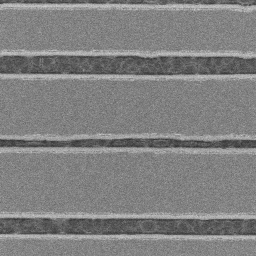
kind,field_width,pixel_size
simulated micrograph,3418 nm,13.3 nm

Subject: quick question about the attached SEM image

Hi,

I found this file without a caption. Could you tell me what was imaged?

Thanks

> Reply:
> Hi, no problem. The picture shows one or a few lines or trenches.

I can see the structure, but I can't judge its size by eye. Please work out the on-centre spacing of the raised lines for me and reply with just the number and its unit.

1020 nanometers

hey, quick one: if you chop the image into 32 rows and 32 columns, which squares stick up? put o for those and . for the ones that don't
................................
oooooooooooooooooooooooooooooooo
oooooooooooooooooooooooooooooooo
oooooooooooooooooooooooooooooooo
oooooooooooooooooooooooooooooooo
oooooooooooooooooooooooooooooooo
oooooooooooooooooooooooooooooooo
................................
................................
o...............................
oooooooooooooooooooooooooooooooo
oooooooooooooooooooooooooooooooo
oooooooooooooooooooooooooooooooo
oooooooooooooooooooooooooooooooo
oooooooooooooooooooooooooooooooo
oooooooooooooooooooooooooooooooo
oooooooooooooooooooooooooooooooo
................................
................................
oooooooooooooooooooooooooooooooo
oooooooooooooooooooooooooooooooo
oooooooooooooooooooooooooooooooo
oooooooooooooooooooooooooooooooo
oooooooooooooooooooooooooooooooo
oooooooooooooooooooooooooooooooo
oooooooooooooooooooooooooooooooo
oooooooooooooooooooooooooooooooo
................................
................................
................................
oooooooooooooooooooooooooooooooo
oooooooooooooooooooooooooooooooo